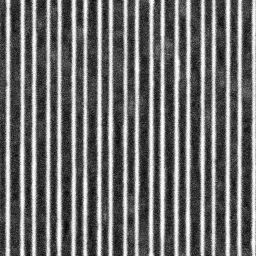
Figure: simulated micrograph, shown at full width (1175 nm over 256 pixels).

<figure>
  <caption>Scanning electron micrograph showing parallel lines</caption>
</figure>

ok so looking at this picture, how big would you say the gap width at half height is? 49.4 nm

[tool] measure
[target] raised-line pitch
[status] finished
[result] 59.5 nm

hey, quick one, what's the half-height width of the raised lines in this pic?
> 12.6 nm